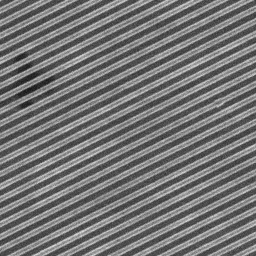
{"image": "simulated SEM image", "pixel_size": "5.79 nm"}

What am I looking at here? parallel lines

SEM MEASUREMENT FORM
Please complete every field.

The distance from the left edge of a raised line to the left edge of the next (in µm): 0.065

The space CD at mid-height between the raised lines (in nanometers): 36.2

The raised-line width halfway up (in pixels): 4.46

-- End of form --